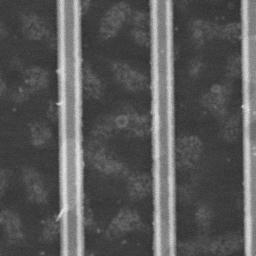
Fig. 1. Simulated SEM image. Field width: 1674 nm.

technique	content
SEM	one or a few lines or trenches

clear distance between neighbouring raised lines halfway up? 507 nanometres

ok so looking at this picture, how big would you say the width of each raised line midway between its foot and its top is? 91.5 nm